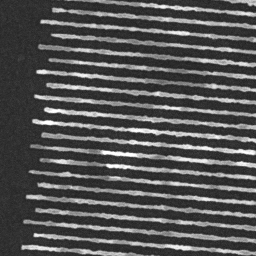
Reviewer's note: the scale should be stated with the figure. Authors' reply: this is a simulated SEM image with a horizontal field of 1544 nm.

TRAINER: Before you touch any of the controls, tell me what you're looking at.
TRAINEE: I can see parallel lines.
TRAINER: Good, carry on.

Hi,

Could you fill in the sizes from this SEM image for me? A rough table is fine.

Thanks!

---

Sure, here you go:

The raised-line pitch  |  0.0756 microns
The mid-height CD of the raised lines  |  0.0195 micrometres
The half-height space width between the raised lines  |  0.0548 microns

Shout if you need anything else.